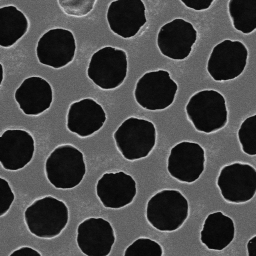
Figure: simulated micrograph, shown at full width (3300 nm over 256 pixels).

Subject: a regular array of holes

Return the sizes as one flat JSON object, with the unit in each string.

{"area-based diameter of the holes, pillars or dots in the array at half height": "0.514 micrometres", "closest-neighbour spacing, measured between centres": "687 nanometres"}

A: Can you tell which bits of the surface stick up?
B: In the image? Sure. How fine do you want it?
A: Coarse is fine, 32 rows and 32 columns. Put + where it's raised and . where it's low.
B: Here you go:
++++++++++++++....+++++...+++...
...++++++++++.....+++++++++++...
...++++++++++.....++++.++++++...
...+++++++++++....++....++++++..
...++....++++++..+++.....+++++++
..+++....+++++++++++....+++...++
+++++....+++...+++++....+++....+
+++++....++.....++++++++++.....+
+++++++++++.....++++++++++.....+
+++++++++++.....++...+++++....++
+++...++++++...++.....++++++++++
++....+++++++++++.....+++..+++++
++....++++.++++++.....++....++++
+++...+++....+++++...++.....++++
+++++++++....+++++++++++....++++
++++++++.....++....+++++....++..
+..++++++...++.....+++++++++++..
....++++++++++.....+++++++++++..
....+++..++++++....+++...+++++..
....++....++++++..+++.....++++++
...+++.....++++++++++....++++.++
++++++.....++++++++++....+++....
.+++++....++.....++++++.+++.....
.++++++..+++.....++++++++++.....
..++++++++++.....++....+++++....
.+++....+++++...++.....+++++++++
.++.....++++++++++.....+++++++++
+++.....+++..++++++....+++...+++
++++....++....++++++..+++....+++
+++++..+++....+++++++++++....+++
++++++++++....++....++++++...++.
++...+++++....++....+++++++++++.